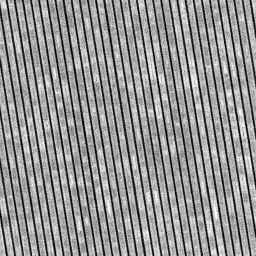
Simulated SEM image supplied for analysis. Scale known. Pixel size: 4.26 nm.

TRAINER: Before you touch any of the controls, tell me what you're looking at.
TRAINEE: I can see parallel lines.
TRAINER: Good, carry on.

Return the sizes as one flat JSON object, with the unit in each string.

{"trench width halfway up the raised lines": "2.58 px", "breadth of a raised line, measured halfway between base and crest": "25.8 nanometres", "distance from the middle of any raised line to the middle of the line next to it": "34.2 nm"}